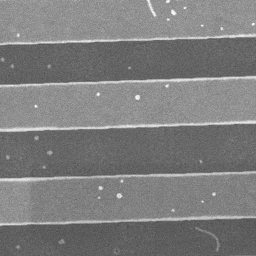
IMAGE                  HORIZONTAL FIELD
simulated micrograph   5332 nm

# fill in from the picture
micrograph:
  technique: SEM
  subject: lines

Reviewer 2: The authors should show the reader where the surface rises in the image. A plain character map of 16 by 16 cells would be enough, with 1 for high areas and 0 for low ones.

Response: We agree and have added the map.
1111111111111111
1111111111111111
1111111111000000
0000000000000000
0000000000000000
1111111111111111
1111111111111111
1111111111111111
0000000000000000
0000000000000000
0000000000000000
1111111111111111
1111111111111111
1111111111111111
0000000000000000
0000000000000000